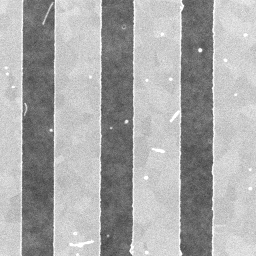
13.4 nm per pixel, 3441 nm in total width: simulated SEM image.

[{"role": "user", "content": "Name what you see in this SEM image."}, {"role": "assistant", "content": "one or a few lines or trenches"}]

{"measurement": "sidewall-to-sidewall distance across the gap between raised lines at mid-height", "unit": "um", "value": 0.437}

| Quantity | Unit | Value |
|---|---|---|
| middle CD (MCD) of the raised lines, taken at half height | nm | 625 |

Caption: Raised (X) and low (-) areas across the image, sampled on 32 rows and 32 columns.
XXX----XXXXXX----XXXXXX----XXXXX
XXX----XXXXXX----XXXXXX----XXXXX
XXX----XXXXXX----XXXXXX----XXXXX
XXX----XXXXXX----XXXXXX----XXXXX
XXX----XXXXXX----XXXXXX----XXXXX
XXX----XXXXXX----XXXXXX----XXXXX
XXX----XXXXXX----XXXXXX----XXXXX
XXX----XXXXXX----XXXXXX----XXXXX
XXX----XXXXXX----XXXXXX----XXXXX
XXX----XXXXXX----XXXXX-----XXXXX
XXX----XXXXXX----XXXXX-----XXXXX
XXX----XXXXXX----XXXXXX----XXXXX
XXX----XXXXXX----XXXXX-----XXXXX
XXX----XXXXXX----XXXXXX----XXXXX
XXX----XXXXXX----XXXXXX----XXXXX
XXX----XXXXX-----XXXXXX----XXXXX
XXX----XXXXXX----XXXXXX----XXXXX
XXX----XXXXXX----XXXXXX----XXXXX
XXX----XXXXXX----XXXXXX----XXXXX
XXX----XXXXXX----XXXXXX----XXXXX
XXX----XXXXXX----XXXXX-----XXXXX
XXX----XXXXXX----XXXXX-----XXXXX
XXX----XXXXXX----XXXXX-----XXXXX
XXX----XXXXXX----XXXXX-----XXXXX
XXX----XXXXX-----XXXXX-----XXXXX
XXX----XXXXX-----XXXXX-----XXXXX
XXX----XXXXXX----XXXXX-----XXXXX
XXX----XXXXX-----XXXXX-----XXXXX
XXX----XXXXX-----XXXXX-----XXXXX
XXX----XXXXX-----XXXXX-----XXXXX
XXX----XXXXXX---XXXXXX-----XXXXX
XXX----XXXXX----XXXXXXX----XXXXX